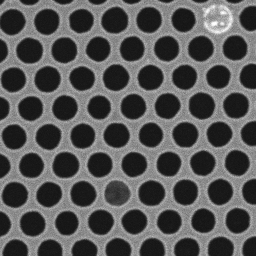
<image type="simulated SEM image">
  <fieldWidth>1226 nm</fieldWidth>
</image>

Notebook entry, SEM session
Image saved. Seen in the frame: a regular array of holes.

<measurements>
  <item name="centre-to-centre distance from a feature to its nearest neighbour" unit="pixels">33.2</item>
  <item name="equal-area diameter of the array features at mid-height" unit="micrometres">0.121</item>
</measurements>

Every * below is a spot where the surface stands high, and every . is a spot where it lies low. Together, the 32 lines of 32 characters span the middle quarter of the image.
****.******....*****...******...
**.....***......***.....****....
*......***......***......**.....
*.......**......**.......**.....
**......**......***......**.....
**.....***......***.....****....
****.******...*******.********.*
*****************.*******..*****
..*****...*****.....***.....****
...***.....***......***......**.
....**......**.......**......**.
...***......**......***......**.
...***.....****.....***.....****
..******..******...******..*****
********************************
***....****....*****....****....
**.....***......***......**.....
**......**......***......**.....
**......**......***......**.....
**.....***......***.....****....
***....*****...******..******...
********************************
..*****....*****...*****....****
...***......***.....****.....***
....**......**.......**......**.
....**......**.......**......***
....**......***.....***......***
...****....****.....****....****
********************************
***...**************...******...
**.....****....****......***....
**......**......***......**.....